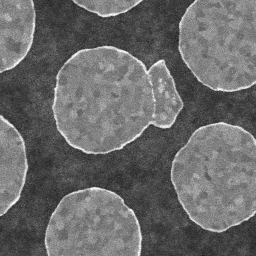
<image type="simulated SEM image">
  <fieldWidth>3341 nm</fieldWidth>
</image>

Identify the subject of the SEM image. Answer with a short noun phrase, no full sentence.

raised bodies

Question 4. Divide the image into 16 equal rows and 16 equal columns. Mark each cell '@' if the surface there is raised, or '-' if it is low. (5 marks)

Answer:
@@---@@@----@@@@
@@---------@@@@@
@@---------@@@@@
@----@@@---@@@@@
----@@@@@@@-@@@@
----@@@@@@@--@@-
---@@@@@@@@-----
---@@@@@@@@-----
@---@@@@@---@@@@
@@----@----@@@@@
@@---------@@@@@
@----------@@@@@
@---@@@@---@@@@@
---@@@@@----@@@@
---@@@@@@-------
---@@@@@@-------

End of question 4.